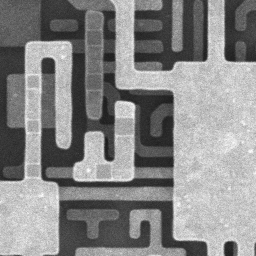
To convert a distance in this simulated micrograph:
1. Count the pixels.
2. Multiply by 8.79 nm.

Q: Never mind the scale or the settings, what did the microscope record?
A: wiring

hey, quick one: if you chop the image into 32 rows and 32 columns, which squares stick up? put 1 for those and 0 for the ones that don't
00000000000000111000000000110000
00000000000100011000000000110000
00000000000110011000000000110000
00000000000110011000000000110000
00000000000110011000000000110000
00011111100110011000000000110000
00011111100110011000000000110000
00011001100110011000000000110000
00011001100110011000001111111111
00011001100110111111111111111111
00011001100110111111111111111111
00011001100110000000011111111111
00011001100110000000001111111111
00011001100110111000001111111111
00011001100110111000001111111111
00011001100000111000001111111111
00011001100000111000001111111111
00011001100110111000001111111111
00011000000110111000001111111111
00011000001110111000001111111111
00011000011111111000001111111111
00011000011111111000001111111111
00011000001111110000001111111111
11111110000000000000001111111111
11111110000000000000001111111111
11111110000000000000001111111111
11111110000000000000001111111111
11111110000000000000001111111111
11111110000000000000001111111111
11111110000000000000001111111111
11111110000000000000000000110011
11111110000000000000000000110011